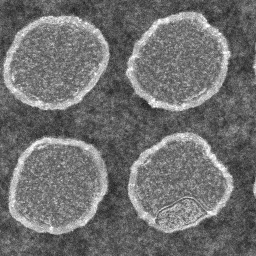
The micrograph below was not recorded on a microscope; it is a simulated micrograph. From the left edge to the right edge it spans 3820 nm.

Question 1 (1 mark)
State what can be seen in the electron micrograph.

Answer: raised bodies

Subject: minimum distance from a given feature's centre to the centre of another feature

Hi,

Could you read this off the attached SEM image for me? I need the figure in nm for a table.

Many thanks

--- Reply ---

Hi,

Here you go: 1770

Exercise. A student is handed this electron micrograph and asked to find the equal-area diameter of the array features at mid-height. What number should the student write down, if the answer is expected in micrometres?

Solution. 1.37